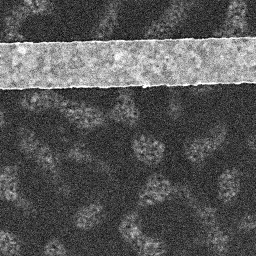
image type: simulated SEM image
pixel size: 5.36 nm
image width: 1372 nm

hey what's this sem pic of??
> one or a few lines or trenches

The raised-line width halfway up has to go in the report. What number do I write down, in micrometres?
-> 0.246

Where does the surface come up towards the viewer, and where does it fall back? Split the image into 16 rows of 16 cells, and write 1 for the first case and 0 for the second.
0000000000000000
0000000000000000
0000000001111111
1111111111111111
1111111111111111
1110000000000000
0000000000000000
0000000000000000
0000000000000000
0000000000000000
0000000000000000
0000000000000000
0000000000000000
0000000000000000
0000000000000000
0000000000000000